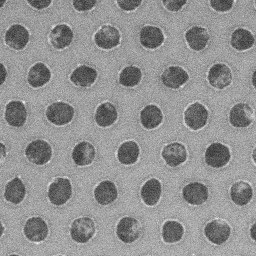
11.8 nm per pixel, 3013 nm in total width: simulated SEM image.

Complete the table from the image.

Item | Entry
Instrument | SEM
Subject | a regular array of raised bodies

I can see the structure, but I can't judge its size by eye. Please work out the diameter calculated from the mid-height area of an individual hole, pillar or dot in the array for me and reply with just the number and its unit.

310 nanometers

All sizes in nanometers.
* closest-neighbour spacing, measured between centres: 517